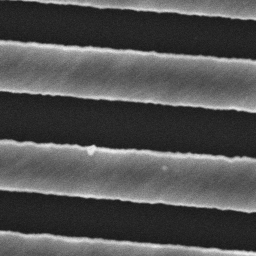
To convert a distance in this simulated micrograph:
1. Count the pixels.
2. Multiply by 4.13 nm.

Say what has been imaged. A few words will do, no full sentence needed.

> lines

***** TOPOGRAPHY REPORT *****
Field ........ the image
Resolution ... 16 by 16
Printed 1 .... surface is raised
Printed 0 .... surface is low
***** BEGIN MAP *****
0000001111111111
0000000000000000
0000000000000000
1111111111110000
1111111111111111
1111111111111111
0000000000111111
0000000000000000
0000000000000000
1111111111000000
1111111111111111
1111111111111111
0000000011111111
0000000000000000
1000000000000000
1111111111111000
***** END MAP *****